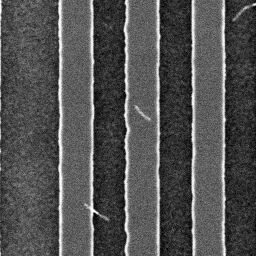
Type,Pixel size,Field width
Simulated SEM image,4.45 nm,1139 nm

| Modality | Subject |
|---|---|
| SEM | lines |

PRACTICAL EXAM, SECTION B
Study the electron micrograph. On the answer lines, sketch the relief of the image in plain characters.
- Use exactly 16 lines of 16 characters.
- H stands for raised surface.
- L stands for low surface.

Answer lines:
LLLLHHLLHHLLHHLL
LLLLHHLLHHLLHHLL
LLLLHHLLHHLLHHLL
LLLLHHLLHHLLHHLL
LLLLHHLLHHLLHHLL
LLLLHHLLHHLLHHLL
LLLLHHLLHHLLHHLL
LLLLHHLLHHLLHHLL
LLLLHHLLHHLLHHLL
LLLLHHLLHHLLHHLL
LLLLHHLLHHLLHHLL
LLLLHHLLHHLLHHLL
LLLLHHLLHHLLHHLL
LLLLHHLLHHLLHHLL
LLLLHHLLHHLLHHLL
LLLLHHLLHHLLHHLL